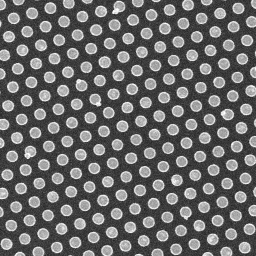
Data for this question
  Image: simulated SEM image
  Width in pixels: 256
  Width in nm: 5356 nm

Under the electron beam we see a regular array of raised bodies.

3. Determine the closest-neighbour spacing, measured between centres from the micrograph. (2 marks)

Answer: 0.395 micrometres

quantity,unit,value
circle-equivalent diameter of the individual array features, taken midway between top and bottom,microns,0.226